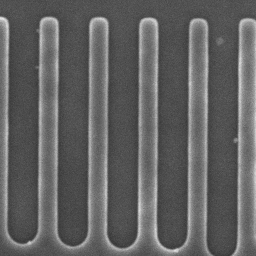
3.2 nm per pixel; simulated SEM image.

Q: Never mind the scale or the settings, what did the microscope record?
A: groups of lines, slits or small figures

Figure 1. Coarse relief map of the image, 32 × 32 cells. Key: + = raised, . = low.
................................
................................
+....++.....+.....+.....+......+
+....++....++.....++....++....++
+....++....++.....++....++....++
+....++....++.....++....++....++
+....++....++.....++....++....++
+....++....++.....++....++....++
+....++....++....+++....++....++
+....++....++....+++....++....++
+....++....++....+++....++....++
+....++....++....+++....++....++
+....++....++....+++....++....++
+....++....++....+++....++....++
+....++....++....+++....++....++
+....++....++....+++....++....++
+....++....++....+++....++....++
+....++....++....+++....++....++
+....++....++....+++....++....++
+....++....++....+++....++....++
+....++....++....+++....++....++
+....++....++....+++....++....++
+....++....++....+++....++....++
+....++....++....+++....++....++
+....++....++....+++....++....++
+....++....++....+++....++....++
+....++....++....+++....++....++
+....++....++....+++....++....++
+....++....++....+++....++....++
+....++....++....+++...+++....++
++++++++..++++...+++...+++....++
++++++++++++++++++++++++++...+++